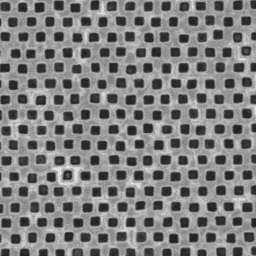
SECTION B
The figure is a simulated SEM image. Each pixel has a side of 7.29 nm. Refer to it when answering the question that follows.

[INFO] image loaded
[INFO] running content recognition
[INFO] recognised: a regular array of holes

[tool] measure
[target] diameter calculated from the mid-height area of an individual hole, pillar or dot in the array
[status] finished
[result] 0.0797 um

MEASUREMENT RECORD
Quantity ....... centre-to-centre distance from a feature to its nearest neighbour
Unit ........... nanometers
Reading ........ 121